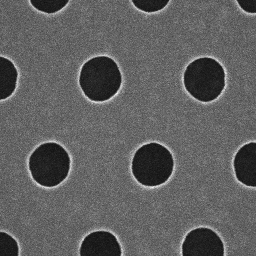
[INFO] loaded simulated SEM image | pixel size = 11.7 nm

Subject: holes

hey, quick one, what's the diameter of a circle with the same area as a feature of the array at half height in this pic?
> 497 nm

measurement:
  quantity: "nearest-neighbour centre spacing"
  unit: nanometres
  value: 1160